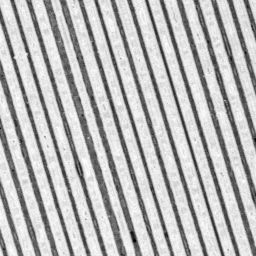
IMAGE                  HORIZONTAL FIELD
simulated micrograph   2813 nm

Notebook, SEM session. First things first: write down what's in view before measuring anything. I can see parallel lines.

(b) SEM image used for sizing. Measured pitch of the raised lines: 176 nanometres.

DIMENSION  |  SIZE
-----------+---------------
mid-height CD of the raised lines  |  103 nanometers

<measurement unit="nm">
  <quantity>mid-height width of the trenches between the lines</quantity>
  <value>75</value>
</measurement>